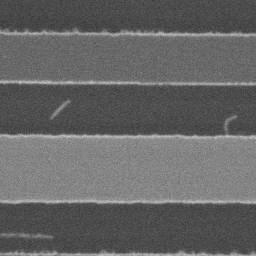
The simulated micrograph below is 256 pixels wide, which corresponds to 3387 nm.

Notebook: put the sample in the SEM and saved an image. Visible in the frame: lines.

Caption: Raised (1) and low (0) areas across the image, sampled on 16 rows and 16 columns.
0000000000000000
0000000000000000
1111111111111111
1111111111111111
1111111111111111
0000000000000000
0000000000000000
0000000000000000
1110101001000000
1111111111111111
1111111111111111
1111111111111111
1111111111111111
0000000000000000
0000000000000000
0000000000000000